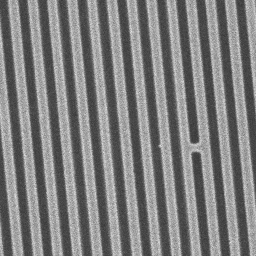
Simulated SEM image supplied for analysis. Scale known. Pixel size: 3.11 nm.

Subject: parallel lines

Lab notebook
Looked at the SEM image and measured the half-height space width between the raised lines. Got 27.1 nm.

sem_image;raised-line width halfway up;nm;33.2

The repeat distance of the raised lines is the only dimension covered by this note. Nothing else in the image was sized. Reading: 61.2 nm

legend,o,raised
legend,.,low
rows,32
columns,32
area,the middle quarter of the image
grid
..ooo..ooo..ooo..ooo..ooo..ooo..
..ooo..ooo..ooo..ooo..ooo..ooo..
...oo..ooo..ooo...oo..ooo..ooo..
...oo...oo..ooo...oo..ooo..ooo..
...oo...oo...oo...oo...oo..ooo..
o..oo...oo...oo...oo...oo...oo..
o..ooo..oo...ooo..oo...oo...oo..
o..ooo..oo...ooo..ooo..oo...oo..
o..ooo..ooo..ooo..ooo..ooo..oo..
o..ooo..ooo..ooo..ooo..ooo..oo..
o..ooo..ooo..ooo..ooo..ooo..ooo.
o..ooo..ooo..ooo..ooo..ooo..ooo.
o...oo..ooo..ooo..ooo..ooo..ooo.
o...oo...oo..ooo...oo..ooo..ooo.
o...oo...oo...oo...oo...oo..ooo.
oo..oo...oo...oo...oo...oo...oo.
oo..oo...oo...ooo..oo...oo...oo.
oo..ooo..oo...ooo..ooo..oo...oo.
oo..ooo..ooo..ooo..ooo..oo...oo.
oo..ooo..ooo..ooo..ooo..ooo..ooo
oo..ooo..ooo..ooo..ooo..ooo..ooo
oo..ooo..ooo..ooo..ooo..ooo..ooo
oo...oo..ooo..ooo..ooo..ooo..ooo
oo...oo...oo..ooo...oo..ooo..ooo
oo...oo...oo...oo...oo...oo..ooo
oo...oo...oo...oo...oo...oo...oo
ooo..oo...oo...oo...oo...oo...oo
ooo..ooo..oo...ooo..oo...oo...oo
ooo..ooo..ooo..ooo..ooo..oo...oo
ooo..ooo..ooo..ooo..ooo..ooo..oo
ooo..ooo..ooo..ooo..ooo..ooo..oo
.oo..ooo..ooo..ooo..ooo..ooo..oo